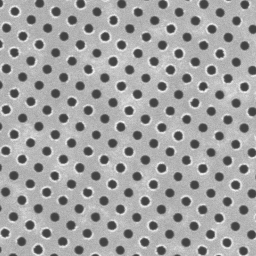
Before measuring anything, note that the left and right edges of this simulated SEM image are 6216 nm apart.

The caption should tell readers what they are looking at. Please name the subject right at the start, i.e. a regular array of holes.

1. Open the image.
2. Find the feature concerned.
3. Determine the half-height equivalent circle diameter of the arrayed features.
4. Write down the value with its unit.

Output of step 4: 236 nanometers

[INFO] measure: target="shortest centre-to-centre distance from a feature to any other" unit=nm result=442